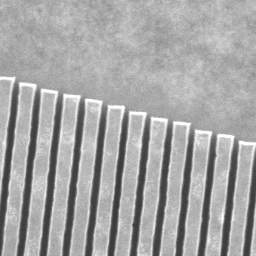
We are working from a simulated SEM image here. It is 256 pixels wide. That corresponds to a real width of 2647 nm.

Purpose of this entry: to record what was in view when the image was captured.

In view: parallel lines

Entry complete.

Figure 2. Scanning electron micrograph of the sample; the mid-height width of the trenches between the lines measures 73.3 nm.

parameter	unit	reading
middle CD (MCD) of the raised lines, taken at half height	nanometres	157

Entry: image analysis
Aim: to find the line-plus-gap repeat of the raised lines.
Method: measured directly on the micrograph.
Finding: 232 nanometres